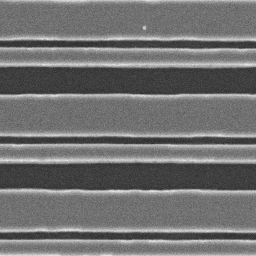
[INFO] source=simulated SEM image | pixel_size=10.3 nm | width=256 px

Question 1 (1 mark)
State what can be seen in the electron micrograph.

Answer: lines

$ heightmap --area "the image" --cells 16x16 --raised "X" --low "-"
XXXXXXXXXXXXXXXX
XXXXXXXXXXXXXXXX
XXXXXXXXXXXXXXXX
XXXXXXXXXXXXXXXX
----------------
----------------
XXXXXXXXXXXXXXXX
XXXXXXXXXXXXXXXX
XXXXXXXXXXXXXXXX
XXXXXXXXXXXXXXXX
----------------
----------------
XXXXXXXXXXXXXXXX
XXXXXXXXXXXXXXXX
XXXXXXXXXXXXXXXX
XXXXXXXXXXXXXXXX